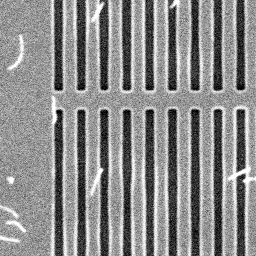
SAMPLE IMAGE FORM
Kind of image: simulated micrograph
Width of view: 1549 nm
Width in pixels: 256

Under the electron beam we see groups of lines, slits or small figures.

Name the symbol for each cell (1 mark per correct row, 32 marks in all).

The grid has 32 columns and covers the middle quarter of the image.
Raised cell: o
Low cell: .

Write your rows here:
ooo...ooo..ooo...ooo...ooo...oo.
ooo...ooo..ooo...ooo...ooo...oo.
ooo...ooo..ooo...ooo...ooo...oo.
ooo...ooo..ooo...ooo...ooo...oo.
ooo...ooo..ooo...ooo...ooo...ooo
ooo...ooo..ooo...ooo...ooo...ooo
ooo..oooo..oooo..ooo..oooo..oooo
oooooooooooooooooooooooooooooooo
oooooooooooooooooooooooooooooooo
oooooooooooooooooooooooooooooooo
oooooooooooooooooooooooooooooooo
oooo.oooo..oooo..oooo.oooo..oooo
ooo...ooo..ooo...ooo...ooo...ooo
ooo...ooo..oooo..ooo...ooo...ooo
ooo...ooo..oooo..ooo...ooo..oooo
ooo...ooo..oooo..ooo...ooo..oooo
ooo...ooo..ooo...ooo...ooo..oooo
ooo...ooo..ooo...ooo...ooo..oooo
ooo...ooo..ooo...ooo...ooo..oooo
ooo...ooo..ooo...ooo...ooo..oooo
ooo...ooo..ooo...ooo...ooo..oooo
ooo...ooo..ooo...ooo...ooo..oooo
ooo...ooo..ooo...ooo...ooo...ooo
ooo...ooo..ooo...ooo...ooo...ooo
ooo...ooo...oo...ooo...ooo...ooo
ooo...ooo..ooo...ooo...ooo...ooo
ooo...ooo..ooo...ooo...ooo...ooo
ooo...ooo..ooo...ooo...ooo...ooo
ooo...ooo..ooo...ooo...ooo...ooo
ooo...ooo..oooo..ooo...ooo...ooo
ooo...ooo..oooo..ooo...ooo...ooo
ooo...ooo..oooo..ooo...ooo...ooo